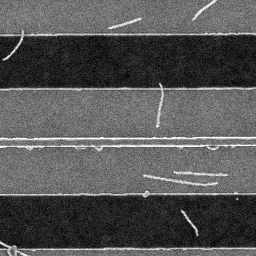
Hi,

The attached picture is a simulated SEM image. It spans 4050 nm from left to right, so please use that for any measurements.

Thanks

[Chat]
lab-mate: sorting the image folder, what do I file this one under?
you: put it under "lines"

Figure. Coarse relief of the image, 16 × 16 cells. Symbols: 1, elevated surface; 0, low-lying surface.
0000000000000000
0000000000000000
1111111111111111
1111111111111111
1111111111111111
1111111111111111
0000000000000000
0000000000000000
0000000000000000
0000000000000000
0000000000000000
0000000000000000
1111111111111111
1111111111111111
1111111111111111
1111111111111111